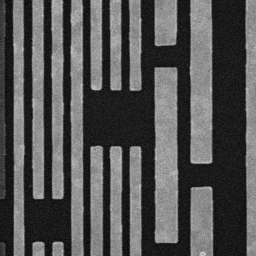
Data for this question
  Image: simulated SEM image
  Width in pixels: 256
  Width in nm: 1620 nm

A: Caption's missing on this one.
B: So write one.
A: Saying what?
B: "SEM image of wiring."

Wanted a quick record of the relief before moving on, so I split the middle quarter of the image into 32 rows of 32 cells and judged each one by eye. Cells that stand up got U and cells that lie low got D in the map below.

DDUUUDDUUDDDUUDDDUUDDDDDDDDDDDDD
DDUUUDDUUDDDUUDDDUUDDDDUUUUUDDDD
DDUUUDDUUDDDUUDDDUUDDDDUUUUUDDDD
DDUUUDDUUDDDUUDDDUUDDDDUUUUUDDDD
DDUUUDDUUDDDUUDDDUUDDDDUUUUUDDDD
DDUUUDDUUDDDUUDDDUUDDDDUUUUUDDDD
DDUUUDDDDDDDDDDDDDDDDDDUUUUUDDDD
DDUUUDDDDDDDDDDDDDDDDDDUUUUUDDDD
DDUUUDDDDDDDDDDDDDDDDDDUUUUUDDDD
DDUUUDDDDDDDDDDDDDDDDDDUUUUUDDDD
DDUUUDDDDDDDDDDDDDDDDDDUUUUUDDDD
DDUUUDDDDDDDDDDDDDDDDDDUUUUUDDDD
DDUUUDDDDDDDDDDDDDDDDDDUUUUUDDDD
DDUUUDDDDDDDDDDDDDDDDDDUUUUUDDDD
DDUUUDDDDDDDDDDDDDDDDDDUUUUUDDDD
DDUUUDDDDDDDDDDDDDDDDDDUUUUUDDDD
DDUUUDDDDDDDDDDDDDDDDDDUUUUUDDDD
DDUUUDDDDDDDDDDDDDDDDDDUUUUUDDDD
DDUUUDDDDDDDDDDDDDDDDDDUUUUUDDDD
DDUUUDDDDDDDDDDDDDDDDDDUUUUUDDDD
DDUUUDDDDDDDDDDDDDDDDDDUUUUUDDDD
DDUUUDDUUUDDUUDDDUUDDDDUUUUUDDDD
DDUUUDDUUUDDUUDDDUUDDDDUUUUUDDDD
DDUUUDDUUUDDUUDDDUUDDDDUUUUUDDDD
DDUUUDDUUUDDUUDDDUUDDDDUUUUUDDDD
DDUUUDDUUUDDUUDDDUUDDDDUUUUUDDDD
DDUUUDDUUUDDUUDDDUUDDDDUUUUUDDDD
DDUUUDDUUUDDUUDDDUUDDDDUUUUUDDDD
DDUUUDDUUUDDUUDDDUUDDDDUUUUUDDDD
DDUUUDDUUUDDUUDDDUUDDDDUUUUUDDDD
DDUUUDDUUUDDUUDDDUUDDDDUUUUUDDDD
DDUUUDDUUUDDUUDDDUUDDDDUUUUUDDDD